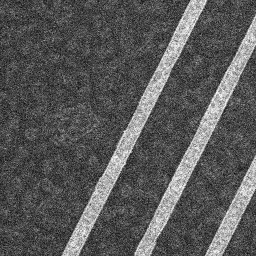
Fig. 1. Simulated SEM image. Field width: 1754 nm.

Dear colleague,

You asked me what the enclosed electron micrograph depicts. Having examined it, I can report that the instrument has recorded one or a few lines or trenches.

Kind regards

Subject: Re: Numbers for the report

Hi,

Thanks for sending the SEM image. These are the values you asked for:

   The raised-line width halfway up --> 92.5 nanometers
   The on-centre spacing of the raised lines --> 438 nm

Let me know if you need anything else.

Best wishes